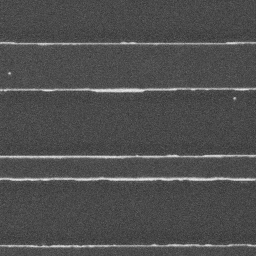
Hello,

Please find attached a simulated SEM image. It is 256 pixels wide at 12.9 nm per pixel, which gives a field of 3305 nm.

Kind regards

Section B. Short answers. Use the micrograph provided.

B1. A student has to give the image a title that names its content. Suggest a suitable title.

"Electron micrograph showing lines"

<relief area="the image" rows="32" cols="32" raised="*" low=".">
................................
................................
................................
................................
................................
********************************
********************************
********************************
********************************
********************************
********************************
................................
................................
................................
................................
................................
................................
................................
................................
.....................*...*******
********************************
********************************
................................
................................
................................
................................
................................
................................
................................
................................
................................
********************************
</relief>